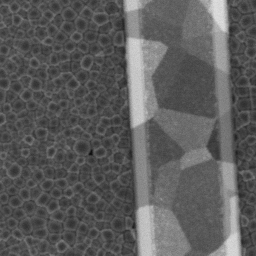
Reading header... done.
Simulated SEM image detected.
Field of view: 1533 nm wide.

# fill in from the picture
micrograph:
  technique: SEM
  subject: one or a few lines or trenches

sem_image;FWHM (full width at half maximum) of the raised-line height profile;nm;517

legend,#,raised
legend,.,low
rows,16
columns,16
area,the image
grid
........######..
........######..
........######..
........######..
........######..
.........#####..
.........#####..
.........#####..
.........#####..
.........#####..
.........#####..
.........#####..
.........#####..
.........#####..
.........#####..
.........######.